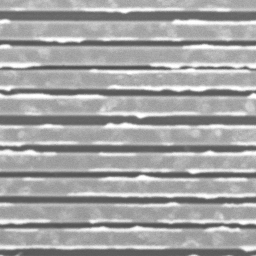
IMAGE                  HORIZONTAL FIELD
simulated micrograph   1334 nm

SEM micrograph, parallel lines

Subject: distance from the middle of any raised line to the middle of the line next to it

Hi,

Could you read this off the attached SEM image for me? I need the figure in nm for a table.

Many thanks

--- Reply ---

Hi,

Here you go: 135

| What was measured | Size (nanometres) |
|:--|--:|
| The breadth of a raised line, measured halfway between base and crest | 105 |